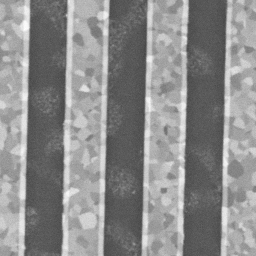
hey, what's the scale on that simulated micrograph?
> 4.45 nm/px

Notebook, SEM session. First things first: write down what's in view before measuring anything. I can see one or a few lines or trenches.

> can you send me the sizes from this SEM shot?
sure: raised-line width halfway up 0.16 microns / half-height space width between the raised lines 192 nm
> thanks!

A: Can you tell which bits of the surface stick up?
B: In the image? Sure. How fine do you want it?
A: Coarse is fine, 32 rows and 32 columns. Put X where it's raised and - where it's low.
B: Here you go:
XXX------XXXX------XXXX------XXX
XXX------XXXX------XXXX------XXX
XXX------XXXX------XXXX------XXX
XXX------XXXX------XXXX------XXX
XXX------XXXX------XXXX------XXX
XXX------XXXX------XXXX------XXX
XXX------XXXX------XXXX------XXX
XXX------XXXX------XXXX------XXX
XXX------XXXX------XXXX-----XXXX
XXX------XXXX------XXXX-----XXXX
XXX------XXXX------XXXX-----XXXX
XXX------XXXX------XXXX-----XXXX
XXX------XXXX------XXXX-----XXXX
XXX------XXXX------XXXX-----XXXX
XXX-----XXXXX-----XXXXX-----XXXX
XXX-----XXXXX-----XXXXX-----XXXX
XXX-----XXXXX-----XXXXX-----XXXX
XXX-----XXXXX-----XXXXX-----XXXX
XXX-----XXXXX-----XXXXX-----XXXX
XXX-----XXXXX-----XXXXX-----XXXX
XXX-----XXXXX-----XXXXX-----XXXX
XXX-----XXXXX-----XXXXX-----XXXX
XXX-----XXXXX-----XXXXX-----XXXX
XXX-----XXXXX-----XXXXX-----XXXX
XXX-----XXXXX-----XXXXX-----XXXX
XXX-----XXXXX-----XXXXX-----XXXX
XXX-----XXXXX-----XXXXX-----XXXX
XXX-----XXXXX-----XXXXX-----XXXX
XXX-----XXXXX-----XXXXX-----XXXX
XXX-----XXXXX-----XXXXX-----XXXX
XXX-----XXXXX-----XXXX------XXXX
XXX-----XXXXX-----XXXX------XXXX